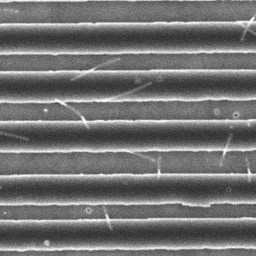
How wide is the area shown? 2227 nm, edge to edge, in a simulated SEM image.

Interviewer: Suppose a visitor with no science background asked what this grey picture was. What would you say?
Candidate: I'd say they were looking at lines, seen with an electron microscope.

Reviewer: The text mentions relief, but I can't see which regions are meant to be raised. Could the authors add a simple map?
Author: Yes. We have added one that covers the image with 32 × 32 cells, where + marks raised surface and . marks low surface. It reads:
................................
................................
................................
++++++++++++++++++++++++++++++++
++++++++++++++++++++++++++++++++
++++++++++++++++++++++++++++++++
+++++++++++++++++++++++++.+.....
................................
................................
++++++++++++++++++++++++++++++++
++++++++++++++++++++++++++++++++
++++++++++++++++++++++++++++++++
+++++++++++++++++++...+++.......
................................
................................
++++++++++++++++++++++++++++++++
++++++++++++++++++++++++++++++++
++++++++++++++++++++++++++++++++
++++++++++++++++++++++++++++++++
................................
................................
................................
++++++++++++++++++++++++++++++++
++++++++++++++++++++++++++++++++
++++++++++++++++++++++++++++++++
+++..++++..............+++......
................................
.........+++++++++++++++++++++++
++++++++++++++++++++++++++++++++
++++++++++++++++++++++++++++++++
++++++++++++++++++++++++++++++++
................................